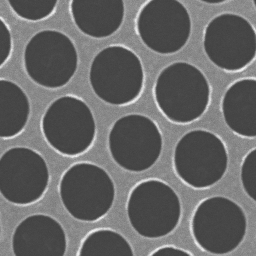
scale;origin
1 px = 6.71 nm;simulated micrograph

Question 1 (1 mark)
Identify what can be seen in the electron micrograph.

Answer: a regular array of holes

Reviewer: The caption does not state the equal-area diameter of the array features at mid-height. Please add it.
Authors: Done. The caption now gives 0.369 microns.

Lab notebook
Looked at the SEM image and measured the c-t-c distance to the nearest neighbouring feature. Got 455 nm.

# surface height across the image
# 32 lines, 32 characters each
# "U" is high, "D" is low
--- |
UDDDDDDUUDDDDDDUUUDDDDDUUUUUUUUU
UUDDDDUUUDDDDDDUUUDDDDDUUUUUUUUU
UUUUUUUUUDDDDDDUUDDDDDDDUUUDDDDU
DUUUUUUUUUDDDDDUUDDDDDDDUUDDDDDD
DUUUDDDDUUUUDUUUUUDDDDDDUUDDDDDD
DUUUDDDDDUUUUUUUUUDDDDDUUDDDDDDD
DUUDDDDDDDUUDDDDUUUUDDUUUUDDDDDD
DUUDDDDDDDUUDDDDDUUUUUUUUUDDDDDU
UUUDDDDDDDUDDDDDDDUUUDDDDUUUDDUU
UUUUDDDDDUUDDDDDDDUUDDDDDUUUUUUU
DDUUUDDDUUUDDDDDDDUUDDDDDDUUUDDD
DDDUUUUUUUUUDDDDDUUDDDDDDDUUDDDD
DDDUUUUDDDUUUDDDUUUUDDDDDDUUDDDD
DDDDUUDDDDDUUUUUUUUUDDDDDDUUDDDD
DDDDUUDDDDDDUUUUDDUUUDDDDUUUDDDD
DDDUUDDDDDDDUUDDDDDUUUUUUUUUDDDD
DDUUUDDDDDDDUUDDDDDDUUUUDDUUUDDD
UUUUUUDDDDDDUUDDDDDDUUUDDDDUUUUU
UUDUUUUDDDDUUUDDDDDDUUDDDDDDUUUU
DDDDDUUUUUUUUUDDDDDDUUDDDDDDUUUD
DDDDDDUUUUDUUUUDDDDUUUDDDDDDUUDD
DDDDDDUUDDDDDUUUUUUUUUDDDDDDUUDD
DDDDDDUUDDDDDDUUUUUUUUUDDDDUUUDD
DDDDDDUUDDDDDDUUUDDDDUUUUUUUUUUD
DDDDDUUUDDDDDDUUDDDDDDUUUUUUUUUD
UUUUUUUUDDDDDDUUDDDDDDUUUDDDDDUU
UUUUUUUUUDDDDUUUDDDDDDUUDDDDDDUU
UUUDDDDUUUDDUUUUDDDDDDUUDDDDDDDU
UUDDDDDDUUUUUUUUUDDDDDUUDDDDDDDU
UUDDDDDDUUUDDDDUUUDDUUUUDDDDDDDU
UUDDDDDDUUDDDDDDUUUUUUUUUDDDDDUU
UUDDDDDDUUDDDDDDDUUDDDDUUUDDDUUU